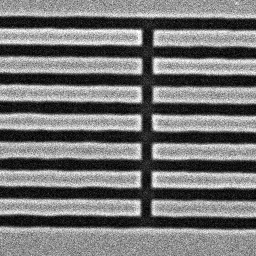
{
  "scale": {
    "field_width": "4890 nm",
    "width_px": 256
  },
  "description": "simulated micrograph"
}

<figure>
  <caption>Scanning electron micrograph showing groups of lines, slits or small figures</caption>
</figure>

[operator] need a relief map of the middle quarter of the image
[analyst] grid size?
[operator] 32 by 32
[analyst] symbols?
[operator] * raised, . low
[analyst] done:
********************..**********
*******************...**********
.................**.............
................................
................................
*...............................
*******************...**********
*******************...**********
*******************...**********
...............****.....********
................................
................................
................................
*******************...**********
*******************...**********
*******************...**********
***.***************...**********
................................
................................
................................
*******************...**********
*******************...**********
*******************...**********
..*****************...**********
................................
................................
................................
*******************...**********
*******************...**********
*******************...**********
*******************...**********
................................